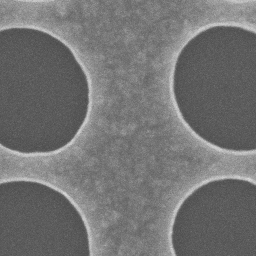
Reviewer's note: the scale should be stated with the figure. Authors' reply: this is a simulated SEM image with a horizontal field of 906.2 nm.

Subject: holes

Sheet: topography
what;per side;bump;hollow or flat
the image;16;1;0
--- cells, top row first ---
1111111111111111
1111111111111111
0000111111110000
0000011111100000
0000011111100000
0000001111100000
0000011111100000
0000011111110000
0000011111110000
1001111111111111
1111111111111111
0001111111111000
0000111111110000
0000011111100000
0000011111100000
0000001111100000